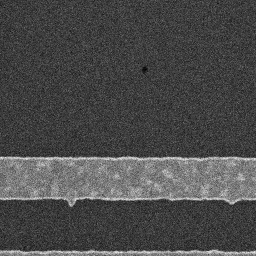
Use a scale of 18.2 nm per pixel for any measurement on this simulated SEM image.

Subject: one or a few lines or trenches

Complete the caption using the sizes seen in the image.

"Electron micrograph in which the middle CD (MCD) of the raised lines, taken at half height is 736 nm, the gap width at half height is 965 nm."